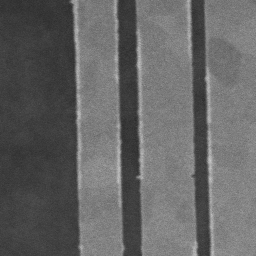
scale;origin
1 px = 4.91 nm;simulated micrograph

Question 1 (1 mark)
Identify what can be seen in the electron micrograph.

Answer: one or a few lines or trenches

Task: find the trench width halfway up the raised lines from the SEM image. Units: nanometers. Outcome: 84.6